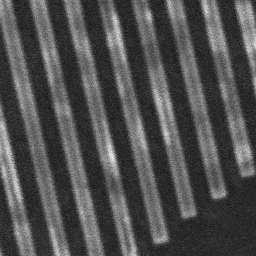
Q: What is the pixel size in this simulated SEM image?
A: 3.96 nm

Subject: parallel lines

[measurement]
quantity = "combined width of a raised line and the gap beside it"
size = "132 nm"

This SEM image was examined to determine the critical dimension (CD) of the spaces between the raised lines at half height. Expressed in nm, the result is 78.7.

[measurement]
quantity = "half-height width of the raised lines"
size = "51.2 nm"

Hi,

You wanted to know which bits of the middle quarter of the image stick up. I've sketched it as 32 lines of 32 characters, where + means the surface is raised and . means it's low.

....+++.....++++.....+++......++
....++++.....+++.....++++.....++
.....+++.....+++......+++.....++
.....+++.....+++......+++.....++
.....+++.....++++.....+++.....++
.....+++......+++.....++++.....+
.....++++.....+++......+++.....+
......+++.....+++......+++.....+
......+++.....++++.....+++.....+
+.....+++......+++.....++++.....
+.....++++.....+++.....++++.....
+......+++.....+++......+++.....
+......+++.....+++......+++.....
++.....+++.....++++.....+++.....
++.....++++.....+++.....++++....
++......+++.....+++......+++....
++......+++.....+++......+++....
+++.....+++.....++++.....+++....
+++.....+++......+++.....++++...
+++.....++++.....+++......+++...
+++......+++.....+++......+++...
++++.....+++.....++++.....+++...
++++.....+++......+++.....+++...
.+++.....++++.....+++.....++++..
.+++......+++.....+++......+++..
.+++......+++.....+++......+++..
.++++.....+++.....++++.....+++..
..+++.....++++.....+++.....++++.
..+++......+++.....+++......+++.
..+++......+++.....+++......+++.
..++++.....+++.....++++.....+++.
...+++.....+++......+++.....++++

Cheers